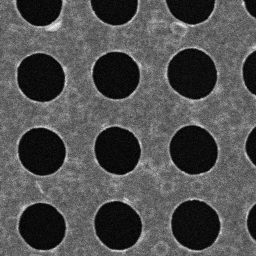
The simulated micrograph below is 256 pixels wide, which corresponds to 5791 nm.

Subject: a regular array of holes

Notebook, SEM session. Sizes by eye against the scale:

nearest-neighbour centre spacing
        1.69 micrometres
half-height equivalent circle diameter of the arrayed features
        1100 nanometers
